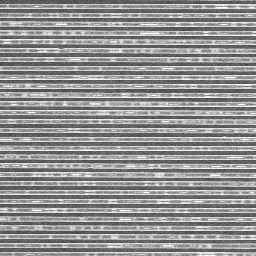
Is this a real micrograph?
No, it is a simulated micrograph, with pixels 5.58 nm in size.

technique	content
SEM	parallel lines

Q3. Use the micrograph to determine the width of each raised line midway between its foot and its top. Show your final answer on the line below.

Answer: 4.87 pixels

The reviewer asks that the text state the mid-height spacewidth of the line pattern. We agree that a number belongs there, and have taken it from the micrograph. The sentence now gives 4 px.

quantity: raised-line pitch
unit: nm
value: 49.4